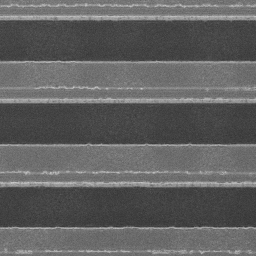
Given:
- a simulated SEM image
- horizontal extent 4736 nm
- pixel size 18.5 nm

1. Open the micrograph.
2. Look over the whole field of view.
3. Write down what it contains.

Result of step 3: lines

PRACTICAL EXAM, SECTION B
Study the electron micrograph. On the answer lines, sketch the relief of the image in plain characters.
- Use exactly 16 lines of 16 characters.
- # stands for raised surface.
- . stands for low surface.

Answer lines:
################
................
................
................
################
################
................
................
................
################
################
................
................
................
################
################